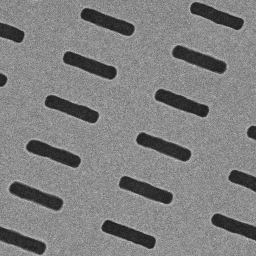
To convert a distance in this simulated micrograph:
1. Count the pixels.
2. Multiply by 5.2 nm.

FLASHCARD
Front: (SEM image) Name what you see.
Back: a regular array of holes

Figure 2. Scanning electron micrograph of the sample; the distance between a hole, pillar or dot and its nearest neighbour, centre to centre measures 244 nanometers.